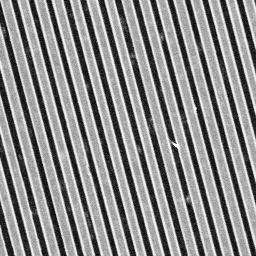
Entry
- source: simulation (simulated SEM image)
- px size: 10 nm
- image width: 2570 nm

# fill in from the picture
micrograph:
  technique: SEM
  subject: parallel lines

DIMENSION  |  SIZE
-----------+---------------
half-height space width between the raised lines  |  78.9 nanometers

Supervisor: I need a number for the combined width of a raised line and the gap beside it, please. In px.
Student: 16.8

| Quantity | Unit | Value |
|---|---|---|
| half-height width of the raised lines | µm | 0.0887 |